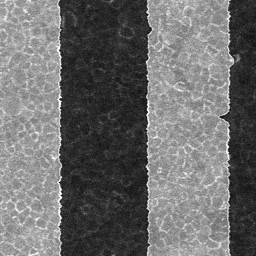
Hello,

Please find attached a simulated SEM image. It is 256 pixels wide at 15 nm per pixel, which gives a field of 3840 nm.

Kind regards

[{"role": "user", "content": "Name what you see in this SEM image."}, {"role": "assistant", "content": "one or a few lines or trenches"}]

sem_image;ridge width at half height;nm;1210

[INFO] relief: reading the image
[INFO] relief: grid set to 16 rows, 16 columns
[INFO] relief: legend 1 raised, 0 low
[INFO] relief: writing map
1111000001111100
1111000001111100
1111000001111100
1111000001111100
1111000001111100
1111000001111100
1111000001111100
1111000001111100
1111000001111100
1111000001111100
1111000001111100
1111000001111100
1111000001111100
1111000001111100
1111000001111100
1111000001111100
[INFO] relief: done